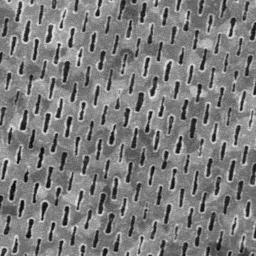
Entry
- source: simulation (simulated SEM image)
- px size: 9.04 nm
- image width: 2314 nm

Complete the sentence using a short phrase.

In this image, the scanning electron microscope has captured a regular array of holes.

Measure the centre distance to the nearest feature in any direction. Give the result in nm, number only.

176